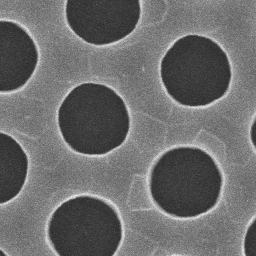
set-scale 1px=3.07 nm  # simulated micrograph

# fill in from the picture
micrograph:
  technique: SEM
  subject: holes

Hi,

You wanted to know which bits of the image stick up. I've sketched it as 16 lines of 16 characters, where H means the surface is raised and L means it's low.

HHHHLLLLLHHHHHHH
LHHHLLLLLHHHHHHH
LLHHHLLHHHHLLHHH
LLHHHHHHHHLLLLHH
LLHHHHHHHHLLLLHH
LHHHHLLHHHLLLLHH
HHHHLLLLHHHLLHHH
HHHHLLLLHHHHHHHH
LHHHLLLLHHHHHHHH
LLHHHLLHHHLLLHHH
LLHHHHHHHLLLLLHH
LHHHHHHHHLLLLLHH
LHHHLLHHHHLLLLHH
HHHLLLLHHHHLHHHH
HHHLLLLLHHHHHHHL
HHHLLLLHHHHHHHHL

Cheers